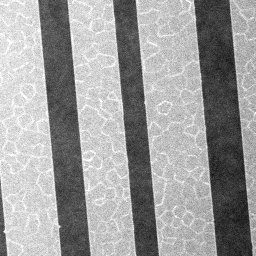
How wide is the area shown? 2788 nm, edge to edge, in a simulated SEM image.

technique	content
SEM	one or a few lines or trenches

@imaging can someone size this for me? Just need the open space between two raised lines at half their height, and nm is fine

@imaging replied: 324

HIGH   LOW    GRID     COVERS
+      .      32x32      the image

+++++....+++++...+++++++.....+++
+++++....+++++...+++++++.....+++
+++++....+++++...+++++++.....+++
+++++....+++++...+++++++.....+++
+++++....+++++...++++++++....+++
+++++....++++++...+++++++....+++
+++++....++++++...+++++++....+++
+++++....++++++...+++++++....+++
+++++....++++++...+++++++....+++
++++++...++++++...+++++++.....++
++++++...++++++...+++++++.....++
++++++....+++++...+++++++.....++
++++++....+++++...+++++++.....++
++++++....+++++...+++++++.....++
++++++....+++++...+++++++.....++
++++++....+++++...++++++++....++
++++++....++++++...+++++++....++
++++++....++++++...+++++++....++
++++++....++++++...+++++++....++
++++++....++++++...+++++++....++
+++++++...++++++...+++++++.....+
+++++++...++++++...+++++++.....+
+++++++....+++++...+++++++.....+
+++++++....+++++...+++++++.....+
+++++++....+++++...+++++++.....+
+++++++....+++++...+++++++.....+
+++++++....+++++...++++++++....+
.++++++....++++++...+++++++....+
.++++++....++++++...+++++++....+
.++++++....++++++...+++++++....+
.++++++....++++++...+++++++.....
.+++++++...++++++...+++++++.....